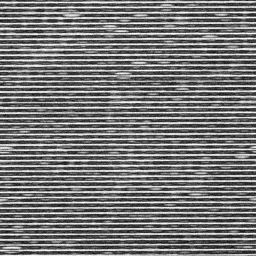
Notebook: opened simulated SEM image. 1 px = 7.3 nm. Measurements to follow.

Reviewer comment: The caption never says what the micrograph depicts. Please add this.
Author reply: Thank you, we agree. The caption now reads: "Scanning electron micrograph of parallel lines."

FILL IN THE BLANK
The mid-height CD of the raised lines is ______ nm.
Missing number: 6.4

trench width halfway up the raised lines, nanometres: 30.1